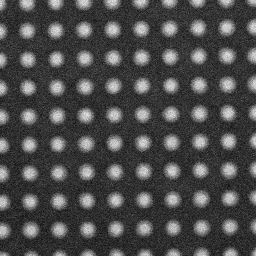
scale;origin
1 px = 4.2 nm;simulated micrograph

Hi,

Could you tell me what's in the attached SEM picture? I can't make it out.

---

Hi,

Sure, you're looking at an array of small figures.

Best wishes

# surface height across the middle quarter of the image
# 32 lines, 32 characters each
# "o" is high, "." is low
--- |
....oo..........................
................................
................................
................................
....ooo....ooo....ooo....ooo....
...oooo...oooo....oooo...oooo...
...oooo....ooo....ooo....ooo....
....ooo.........................
................................
................................
................................
....ooo....ooo....ooo....ooo....
...oooo....oooo...oooo...oooo...
...oooo....ooo....oooo...oooo...
....ooo.....oo.....oo...........
................................
................................
................................
....ooo....ooo....ooo....oooo...
....oooo...oooo...oooo...oooo...
....oooo...oooo...oooo...oooo...
....ooo.....oo.....oo.....oo....
................................
................................
................................
....ooo....ooo.....ooo...oooo...
o...oooo...oooo...oooo...oooo...
o...oooo...oooo...oooo...oooo...
....ooo....ooo.....oo.....oo....
................................
................................
................................